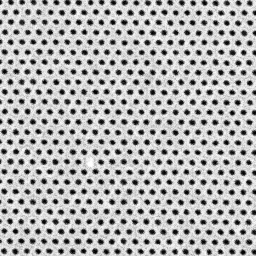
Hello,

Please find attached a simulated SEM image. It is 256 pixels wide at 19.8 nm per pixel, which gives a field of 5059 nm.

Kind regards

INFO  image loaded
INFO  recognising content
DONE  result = a regular array of holes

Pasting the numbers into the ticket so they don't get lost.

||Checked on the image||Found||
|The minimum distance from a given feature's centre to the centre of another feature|216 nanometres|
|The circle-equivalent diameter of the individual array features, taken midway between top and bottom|137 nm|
